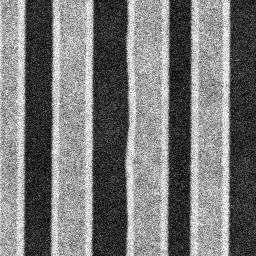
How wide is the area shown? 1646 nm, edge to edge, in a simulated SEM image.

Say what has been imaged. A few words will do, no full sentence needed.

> one or a few lines or trenches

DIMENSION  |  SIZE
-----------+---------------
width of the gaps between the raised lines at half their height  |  225 nm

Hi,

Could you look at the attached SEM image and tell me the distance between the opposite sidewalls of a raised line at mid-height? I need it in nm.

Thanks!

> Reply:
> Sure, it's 208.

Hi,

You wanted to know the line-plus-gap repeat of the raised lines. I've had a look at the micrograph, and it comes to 444 nm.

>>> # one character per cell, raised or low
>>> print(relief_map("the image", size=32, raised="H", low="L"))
HHHLLLLHHHHLLLLLHHHHHLLLHHHHLLLL
HHHLLLLHHHHLLLLLHHHHHLLLHHHHLLLL
HHHLLLLHHHHLLLLLHHHHHLLLHHHHLLLL
HHHLLLLHHHHLLLLLHHHHHLLLHHHHLLLL
HHHLLLLHHHHLLLLLHHHHHLLLHHHHLLLL
HHHLLLLHHHHLLLLLHHHHHLLLLHHHLLLL
HHHLLLLHHHHLLLLLHHHHHLLLLHHHLLLL
HHHLLLLHHHHLLLLLHHHHHLLLHHHHLLLL
HHHLLLLHHHHLLLLLHHHHHLLLHHHHLLLL
HHHLLLLHHHHLLLLLHHHHHLLLLHHHLLLL
HHHLLLLHHHHLLLLLLHHHHLLLLHHHLLLL
HHHLLLLHHHHLLLLLLHHHHLLLLHHHLLLL
HHHLLLLHHHHLLLLLLHHHHLLLLHHHLLLL
HHHLLLLHHHHLLLLLLHHHHLLLHHHHLLLL
HHHLLLLHHHHLLLLLLHHHHLLLHHHHLLLL
HHHLLLLHHHHLLLLLLHHHHLLLHHHHLLLL
HHHLLLLHHHHLLLLLLHHHHLLLHHHHLLLL
HHHLLLLHHHHLLLLLHHHHHLLLHHHHLLLL
HHHLLLLHHHHLLLLLHHHHHLLLHHHHLLLL
HHHLLLLHHHHLLLLLHHHHHLLLHHHHLLLL
HHHLLLLHHHHLLLLLHHHHHLLLHHHHLLLL
HHLLLLLHHHHLLLLLHHHHHLLLHHHHLLLL
HHLLLLLHHHHLLLLLHHHHHLLLHHHHLLLL
HHLLLLLHHHHLLLLLHHHHHLLLHHHHLLLL
HHLLLLLHHHHLLLLLHHHHHLLLHHHHLLLL
HHLLLLLHHHHLLLLLHHHHLLLLHHHHLLLL
HHLLLLLHHHHLLLLLHHHHLLLLHHHHLLLL
HHLLLLLHHHHLLLLLHHHHLLLLHHHHLLLL
HHLLLLLHHHHLLLLLHHHHLLLLHHHHLLLL
HHLLLLLHHHHLLLLLHHHHLLLLHHHHLLLL
HHLLLLLHHHHLLLLLHHHHLLLLHHHHLLLL
HHLLLLLHHHHLLLLLHHHHLLLLHHHHLLLL